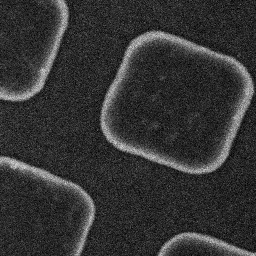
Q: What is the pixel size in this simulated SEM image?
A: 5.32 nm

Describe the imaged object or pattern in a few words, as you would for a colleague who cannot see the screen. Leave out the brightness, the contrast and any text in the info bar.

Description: raised bodies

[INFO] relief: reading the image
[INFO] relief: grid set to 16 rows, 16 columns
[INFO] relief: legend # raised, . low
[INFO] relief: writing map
####............
####............
####.....##.....
###.....######..
###.....#######.
##.....#########
.......########.
......#########.
.......########.
.........#####..
##.........##...
####............
######..........
######..........
#####...........
#####.....#####.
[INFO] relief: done